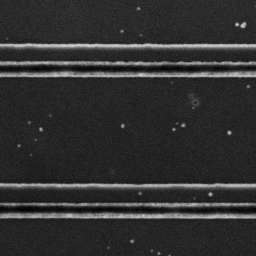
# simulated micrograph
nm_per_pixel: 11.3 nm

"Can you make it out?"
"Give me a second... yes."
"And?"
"lines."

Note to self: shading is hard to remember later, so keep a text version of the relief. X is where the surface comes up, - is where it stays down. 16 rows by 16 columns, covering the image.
----------------
----------------
----------------
XXXXXXXXXXXXXXXX
XXXXXXXXXXXXXXXX
----------------
----------------
----------------
----------------
----------------
----------------
----------------
XXXXXXXXXXXXXXXX
XXXXXXXXXXXXXXXX
----------------
----------------